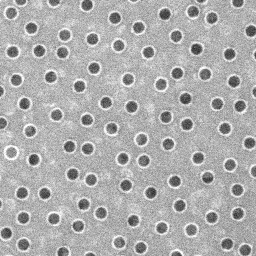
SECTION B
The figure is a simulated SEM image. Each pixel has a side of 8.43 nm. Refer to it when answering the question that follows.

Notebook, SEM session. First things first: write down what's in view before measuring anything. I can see a regular array of raised bodies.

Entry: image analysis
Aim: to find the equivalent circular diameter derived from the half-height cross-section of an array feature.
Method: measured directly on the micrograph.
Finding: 113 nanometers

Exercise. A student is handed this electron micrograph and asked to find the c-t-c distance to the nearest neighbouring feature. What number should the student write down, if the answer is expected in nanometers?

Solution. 203